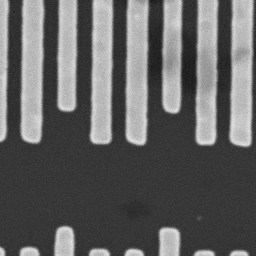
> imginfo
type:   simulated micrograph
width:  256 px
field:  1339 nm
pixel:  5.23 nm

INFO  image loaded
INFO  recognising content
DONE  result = wiring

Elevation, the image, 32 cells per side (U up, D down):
UDDUUDDUUUDDUUDDUUDDDUUDDUUDDUUU
UDDUUDDUUUDDUUDDUUDDDUUDDUUDDUUU
UDDUUDDUUUDDUUDDUUDDDUUDDUUDDUUU
UDDUUDDUUUDDUUDDUUDDDUUDDUUDDUUU
UDDUUDDUUUDDUUDDUUDDDUUDDUUDDUUU
UDDUUDDUUUDDUUDDUUDDDUUDDUUDDUUU
UDDUUDDUUUDDUUDDUUDDUUUDDUUDDUUU
UDDUUDDUUUDDUUDDUUDDUUDDDUUDDUUD
UDDUUDDUUDDDUUDDUUDDUUDDDUUDDUUD
UDDUUDDUUDDDUUDDUUDDUUDDDUUDDUUD
UDDUUDDUUDDDUUDDUUDDUUDDDUUDDUUD
UDDUUDDUUDDDUUDDUUDDUUDDDUUDDUUD
UDDUUDDUUDDUUUDDUUDDUUDDDUUDDUUD
UDDUUDDDUDDDUUDDUUDDDUDDDUUDDUUD
UDDUUDDDDDDUUUDDUUDDDDDDDUUDDUUD
UDDUUDDDDDDUUUDDUUDDDDDDDUUDDUUD
UDDUUDDDDDDUUUDDUUDDDDDDDUUDDUUD
DDDUUDDDDDDUUUDDUUDDDDDDDUUDDUUD
DDDDDDDDDDDDDDDDDDDDDDDDDDDDDDDD
DDDDDDDDDDDDDDDDDDDDDDDDDDDDDDDD
DDDDDDDDDDDDDDDDDDDDDDDDDDDDDDDD
DDDDDDDDDDDDDDDDDDDDDDDDDDDDDDDD
DDDDDDDDDDDDDDDDDDDDDDDDDDDDDDDD
DDDDDDDDDDDDDDDDDDDDDDDDDDDDDDDD
DDDDDDDDDDDDDDDDDDDDDDDDDDDDDDDD
DDDDDDDDDDDDDDDDDDDDDDDDDDDDDDDD
DDDDDDDDDDDDDDDDDDDDDDDDDDDDDDDD
DDDDDDDDDDDDDDDDDDDDDDDDDDDDDDDD
DDDDDDDDUDDDDDDDDDDDDDDDDDDDDDDD
DDDDDDDUUDDDDDDDDDDDUUDDDDDDDDDD
DDDDDDDUUDDDDDDDDDDDUUDDDDDDDDDD
DDDUUDDUUDDUUDDDUUDDUUDDDUDDDUUD